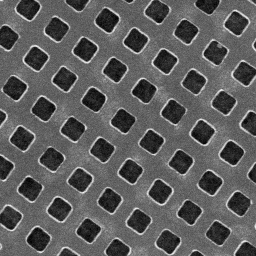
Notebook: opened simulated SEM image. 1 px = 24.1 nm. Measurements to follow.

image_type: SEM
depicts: a regular array of holes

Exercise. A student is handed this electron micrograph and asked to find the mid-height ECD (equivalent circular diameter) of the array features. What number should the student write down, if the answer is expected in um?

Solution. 0.543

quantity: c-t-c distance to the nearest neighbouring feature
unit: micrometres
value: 0.861